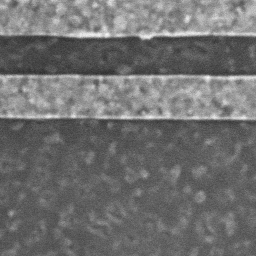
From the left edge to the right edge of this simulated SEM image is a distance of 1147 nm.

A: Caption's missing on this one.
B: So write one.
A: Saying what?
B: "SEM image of one or a few lines or trenches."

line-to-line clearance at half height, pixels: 40.5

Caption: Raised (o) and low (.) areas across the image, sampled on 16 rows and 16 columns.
oooooooooooooooo
oooooooooooooooo
................
................
................
oooooooooooooooo
oooooooooooooooo
................
................
................
................
................
................
................
................
................